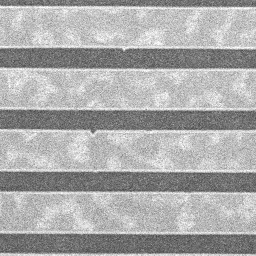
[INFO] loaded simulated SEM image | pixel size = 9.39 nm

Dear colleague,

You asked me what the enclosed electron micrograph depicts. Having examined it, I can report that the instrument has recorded parallel lines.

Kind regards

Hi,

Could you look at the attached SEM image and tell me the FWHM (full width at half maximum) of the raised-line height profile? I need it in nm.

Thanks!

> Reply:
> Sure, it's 375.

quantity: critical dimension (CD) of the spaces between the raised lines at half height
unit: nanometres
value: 206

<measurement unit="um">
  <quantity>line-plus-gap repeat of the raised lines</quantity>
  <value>0.581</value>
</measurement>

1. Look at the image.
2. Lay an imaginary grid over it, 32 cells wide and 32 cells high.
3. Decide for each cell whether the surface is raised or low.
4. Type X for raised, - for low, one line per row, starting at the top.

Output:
--------------------------------
XXXXXXXXXXXXXXXXXXXXXXXXXXXXXXXX
XXXXXXXXXXXXXXXXXXXXXXXXXXXXXXXX
XXXXXXXXXXXXXXXXXXXXXXXXXXXXXXXX
XXXXXXXXXXXXXXXXXXXXXXXXXXXXXXXX
XXXXXXXXXXXXXXXXXXXXXXXXXXXXXXXX
--------------------------------
--------------------------------
--------------------------------
XXXXXXXXXXXXXXXXXXXXXXXXXXXXXXXX
XXXXXXXXXXXXXXXXXXXXXXXXXXXXXXXX
XXXXXXXXXXXXXXXXXXXXXXXXXXXXXXXX
XXXXXXXXXXXXXXXXXXXXXXXXXXXXXXXX
---XXXXXXXXXXXXXXXXXXXXXXXXXXXXX
--------------------------------
--------------------------------
XXXXXXXXXXX-XXXXXXX---------XXXX
XXXXXXXXXXXXXXXXXXXXXXXXXXXXXXXX
XXXXXXXXXXXXXXXXXXXXXXXXXXXXXXXX
XXXXXXXXXXXXXXXXXXXXXXXXXXXXXXXX
XXXXXXXXXXXXXXXXXXXXXXXXXXXXXXXX
--------------------------------
--------------------------------
--------------------------------
XXXXXXXXXXXXXXXXXXXXXXXXXXXXXXXX
XXXXXXXXXXXXXXXXXXXXXXXXXXXXXXXX
XXXXXXXXXXXXXXXXXXXXXXXXXXXXXXXX
XXXXXXXXXXXXXXXXXXXXXXXXXXXXXXXX
XXXXXXXXXXXXXXXXXXXXXXXXXXXXXXXX
--------------------------------
--------------------------------
--------------------------------